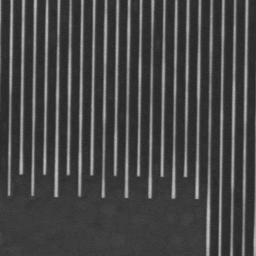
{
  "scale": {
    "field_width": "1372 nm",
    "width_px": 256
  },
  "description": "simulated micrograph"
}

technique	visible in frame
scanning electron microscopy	parallel lines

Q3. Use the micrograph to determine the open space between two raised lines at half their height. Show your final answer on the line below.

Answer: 50.2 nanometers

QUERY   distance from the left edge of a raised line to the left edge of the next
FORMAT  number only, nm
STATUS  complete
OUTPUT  62.9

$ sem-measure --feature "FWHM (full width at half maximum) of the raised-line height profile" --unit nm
10